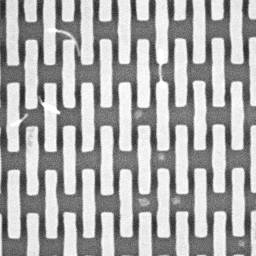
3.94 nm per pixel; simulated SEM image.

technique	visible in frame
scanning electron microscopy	groups of lines, slits or small figures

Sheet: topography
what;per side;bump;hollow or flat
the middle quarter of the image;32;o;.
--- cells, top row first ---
oo.......ooo......ooo.......oo..
oo.......ooo......ooo.......oo..
oo.......ooo......ooo.......ooo.
oo.......ooo......ooo.......ooo.
oo.......ooo......ooo...o...ooo.
oo..ooo..ooo..oo...oo..ooo..ooo.
oo..ooo..ooo..ooo.ooo..ooo..ooo.
oo..ooo..ooo..ooo.ooo..ooo..ooo.
ooo.ooo..ooo..ooo..oo..ooo..oo..
ooo.ooo..ooo..ooo.ooo..ooo..oo..
ooo.ooo..ooo..ooo..oo..ooo......
....ooo.......ooo......ooo......
....ooo.......ooo......ooo......
.....oo.......ooo......ooo......
.....oo.......ooo......ooo......
.....oo.......ooo......ooo......
ooo..oo..ooo..ooo..oo..ooo..ooo.
ooo..oo..ooo..ooo..oo..ooo..ooo.
ooo..oo..ooo..ooo..oo..ooo..ooo.
ooo..oo..ooo..ooo..oo..ooo..ooo.
ooo..oo..ooo..ooo..oo..ooo..ooo.
ooo..oo..ooo...o...oo.......ooo.
ooo......ooo.......oo.......ooo.
ooo......ooo.......oo.......ooo.
ooo......ooo.......oo.......ooo.
ooo......ooo.......oo.......ooo.
ooo..oo..ooo...o...oo...oo..ooo.
ooo..oo..ooo..ooo..oo..ooo..ooo.
ooo..oo..ooo..ooo..oo..ooo..ooo.
ooo..oo..ooo..ooo..oo...oo..ooo.
ooo..oo..ooo..ooo..oo...oo..ooo.
ooo..oo..ooo..ooo..oo..ooo..ooo.